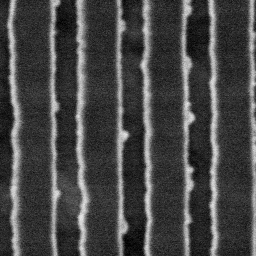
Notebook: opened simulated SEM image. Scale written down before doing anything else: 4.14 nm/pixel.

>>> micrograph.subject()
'lines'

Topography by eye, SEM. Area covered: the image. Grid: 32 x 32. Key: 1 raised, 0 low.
01111110001111100011111000111111
01111110001111100011111000111111
01111110001111100011111000111111
01111110001111100011111000111110
01111110001111100011111000111110
01111110001111100011111000111110
01111110001111100011111000111110
01111110001111100011111000011111
01111110001111100011111000011111
01111110001111100011111000011111
01111110001111100011111000111111
00111110001111100011111000011111
00111110001111100011111000011111
00111110001111100011111000011111
00111110001111100011111100011111
00111110001111100011111000011111
00111110001111100011111000011111
00111110001111100011111000011111
00111110001111100011111000011111
00111110001111100011111000011111
00111110001111100011111000011111
00111110001111100011111100011111
00111110001111100011111100011111
00111110001111100011111100011111
00111110001111100011111100011111
00111110001111100011111000111111
00111110001111100011111000011111
00111110001111100011111000011111
00111110001111110011111000011111
00111110001111100011111000011111
00111110001111100011111100011111
00111110001111100011111100111111